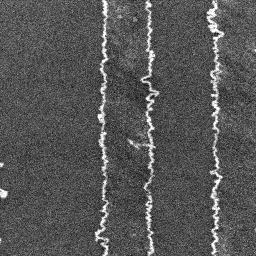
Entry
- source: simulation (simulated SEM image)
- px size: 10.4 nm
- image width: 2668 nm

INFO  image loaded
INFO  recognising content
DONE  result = one or a few lines or trenches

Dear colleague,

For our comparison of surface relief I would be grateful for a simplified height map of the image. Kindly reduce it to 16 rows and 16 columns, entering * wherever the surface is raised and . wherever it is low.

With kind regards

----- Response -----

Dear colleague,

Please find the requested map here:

......***....***
.......**....***
......***....***
......***....***
......***....***
......****...***
......***....***
......***....***
......***....***
......****...***
.......**....***
.......**....***
.......**....***
......***....***
......***....***
.......***...***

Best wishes